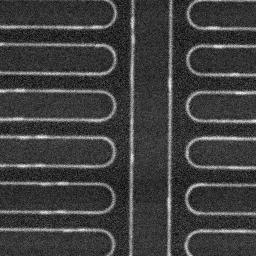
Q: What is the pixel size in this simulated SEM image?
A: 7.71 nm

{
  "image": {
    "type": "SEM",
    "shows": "groups of lines, slits or small figures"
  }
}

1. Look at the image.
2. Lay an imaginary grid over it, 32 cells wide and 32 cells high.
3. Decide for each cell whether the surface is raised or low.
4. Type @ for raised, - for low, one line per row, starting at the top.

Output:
--------------@@@----@@@--------
--------------@@@----@@@--------
--------------@@@----@@@--------
@@@@@@@@@@@@@@@@@----@@@@-------
@@@@@@@@@@@@@@@@@----@@@@@@@@@@@
@@@@@@@@@@@@@@@@@----@@@@@@@@@@@
--------------@@@----@@@--------
--------------@@@----@@@--------
--------------@@-----@@@--------
@@@@@@@@@@@@@@@@-----@@@@@@@@@@@
@@@@@@@@@@@@@@@@-----@@@@@@@@@@@
-------------@@@-----@@@@@@@@@@@
--------------@@-----@@@--------
--------------@@-----@@@--------
--------------@@-----@@@--------
@@@@@@@@@@@@@@@@-----@@@@@@@@@@@
@@@@@@@@@@@@@@@@-----@@@@@@@@@@@
-------------@@@-----@@@@-------
--------------@@-----@@@--------
--------------@@-----@@@--------
-------------@@@-----@@@--------
@@@@@@@@@@@@@@@@-----@@@@@@@@@@@
@@@@@@@@@@@@@@@@-----@@@@@@@@@@@
--------------@@-----@@@--------
--------------@@-----@@---------
--------------@@-----@@@--------
-------------@@@-----@@@--------
@@@@@@@@@@@@@@@@-----@@@@@@@@@@@
@@@@@@@@@@@@@@@@-----@@@@@@@@@@@
--------------@@-----@@@--------
--------------@@-----@@---------
--------------@@-----@@@--------